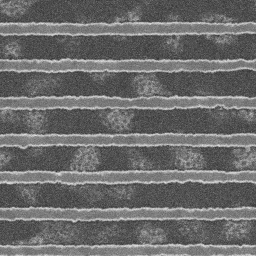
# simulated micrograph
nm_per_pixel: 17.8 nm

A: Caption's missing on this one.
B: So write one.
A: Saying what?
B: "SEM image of parallel lines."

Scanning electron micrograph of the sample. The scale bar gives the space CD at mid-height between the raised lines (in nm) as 467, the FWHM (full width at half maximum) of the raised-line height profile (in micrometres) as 0.189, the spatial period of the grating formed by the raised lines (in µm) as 0.659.